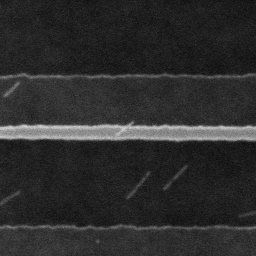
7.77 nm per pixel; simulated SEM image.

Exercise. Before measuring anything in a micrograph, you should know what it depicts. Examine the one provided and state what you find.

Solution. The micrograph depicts lines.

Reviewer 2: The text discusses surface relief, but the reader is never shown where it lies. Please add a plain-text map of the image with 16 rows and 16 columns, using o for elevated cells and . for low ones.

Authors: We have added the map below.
................
................
................
................
................
oooooooooooooooo
oooooooooooooooo
oooooooooooooooo
oooooooooooooooo
................
................
................
................
................
oooooooooooooooo
oooooooooooooooo